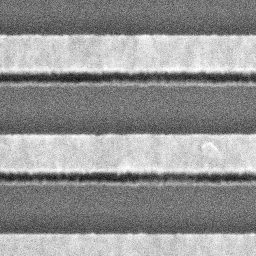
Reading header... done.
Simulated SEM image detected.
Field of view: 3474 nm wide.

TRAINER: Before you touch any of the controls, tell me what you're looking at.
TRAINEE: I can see lines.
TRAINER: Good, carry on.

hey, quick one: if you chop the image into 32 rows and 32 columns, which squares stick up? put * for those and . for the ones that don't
................................
................................
................................
................................
*.***...****.***.****.....*....*
********************************
********************************
********************************
********************************
................................
................................
................................
................................
................................
................................
................................
................................
********************************
********************************
********************************
********************************
................................
................................
................................
................................
................................
................................
................................
................................
********************************
********************************
********************************